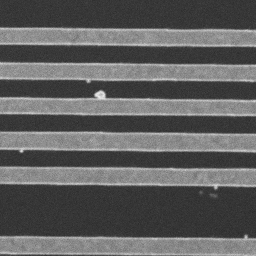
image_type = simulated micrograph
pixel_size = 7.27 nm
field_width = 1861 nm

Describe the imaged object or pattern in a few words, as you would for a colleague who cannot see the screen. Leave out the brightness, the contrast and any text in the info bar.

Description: wiring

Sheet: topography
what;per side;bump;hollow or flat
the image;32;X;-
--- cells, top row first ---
--------------------------------
--------------------------------
--------------------------------
--------------------------------
XXXXXXXXXXXXXXXXXXXXXXXXXXXXXXXX
XXXXXXXXXXXXXXXXXXXXXXXXXXXXXXXX
--------------------------------
--------------------------------
XXXXXXXXXXXXXXXXXXXXXXXXXXXXXXXX
XXXXXXXXXXXXXXXXXXXXXXXXXXXXXXXX
--------------------------------
--------------------------------
XXXXXXXXXXXXXXXXXXXXXXXXXXXXXX--
XXXXXXXXXXXXXXXXXXXXXXXXXXXXXXXX
--------------------------------
--------------------------------
--------------------------------
XXXXXXXXXXXXXXXXXXXXXXXXXXXXXXXX
XXXXXXXXXXXXXXXXXXXXXXXXXXXXXXXX
--------------------------------
--------------------------------
XXXXXXXXXXXXXXXXXXXXXXXXXXXXXXXX
XXXXXXXXXXXXXXXXXXXXXXXXXXXXXXXX
--------------------------------
--------------------------------
--------------------------------
--------------------------------
--------------------------------
--------------------------------
--------------------------------
XXXXXXXXXXXXXXXXXXXXXXXXXXXXXXXX
XXXXXXXXXXXXXXXXXXXXXXXXXXXXXXXX